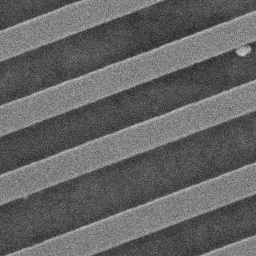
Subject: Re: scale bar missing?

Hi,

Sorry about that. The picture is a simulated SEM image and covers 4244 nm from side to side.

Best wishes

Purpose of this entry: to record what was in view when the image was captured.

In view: lines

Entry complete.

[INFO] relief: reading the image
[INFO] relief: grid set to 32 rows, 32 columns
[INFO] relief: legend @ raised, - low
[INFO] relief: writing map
---------@@@@@@@@@@-------------
------@@@@@@@@@@----------------
----@@@@@@@@@@---------------@@@
-@@@@@@@@@@---------------@@@@@@
@@@@@@@@@---------------@@@@@@@@
@@@@@@---------------@@@@@@@@@@-
@@@---------------@@@@@@@@@@--@-
----------------@@@@@@@@@-------
-------------@@@@@@@@@@---------
----------@@@@@@@@@@------------
--------@@@@@@@@@@-------------@
-----@@@@@@@@@@-------------@@@@
--@@@@@@@@@@-------------@@@@@@@
@@@@@@@@@--------------@@@@@@@@@
@@@@@@@-------------@@@@@@@@@@--
@@@@-------------@@@@@@@@@@-----
@@-------------@@@@@@@@@@-------
------------@@@@@@@@@@----------
---------@@@@@@@@@@-------------
------@@@@@@@@@@----------------
----@@@@@@@@@@-----------------@
-@@@@@@@@@@------------------@@@
@@@@@@@@------------------@@@@@@
@@@@@@-----------------@@@@@@@@@
@@@------------------@@@@@@@@@@-
------------------@@@@@@@@@@----
---------------@@@@@@@@@@@------
-------------@@@@@@@@@@---------
----------@@@@@@@@@@------------
--------@@@@@@@@@@--------------
-----@@@@@@@@@@--------------@@@
--@@@@@@@@@@--------------@@@@@@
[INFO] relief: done